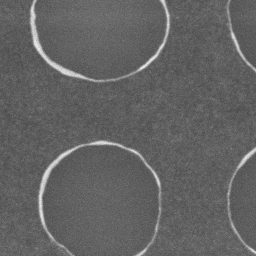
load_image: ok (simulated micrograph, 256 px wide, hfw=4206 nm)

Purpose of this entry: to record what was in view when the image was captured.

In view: holes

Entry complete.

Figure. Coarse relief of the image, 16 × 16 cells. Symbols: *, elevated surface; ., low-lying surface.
**........****..
**........****..
**........*****.
***.......*****.
****....********
****************
****************
****************
****************
****....********
***......******.
***.......****..
***.......****..
***.......****..
***.......*****.
****.....*******